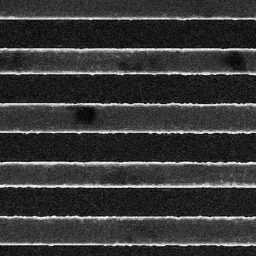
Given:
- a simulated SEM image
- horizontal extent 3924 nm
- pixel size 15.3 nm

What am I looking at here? lines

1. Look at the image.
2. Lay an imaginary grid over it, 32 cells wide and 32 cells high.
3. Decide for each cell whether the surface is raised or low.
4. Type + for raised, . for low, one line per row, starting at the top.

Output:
++++++++++++++++++++++++++++++++
++++++++++++++++++++++++++++++++
................................
................................
................................
................................
++++++++++++++++++++++++++++++++
++++++++++++++++++++++++++++++++
++++++++++++++++++++++++++++++++
................................
................................
................................
................................
++++++++++++++++++++++++++++++++
++++++++++++++++++++++++++++++++
++++++++++++++++++++++++++++++++
++++++++++++++++++++++++++++++++
................................
................................
................................
++++++++++++++++++++++++++++++++
++++++++++++++++++++++++++++++++
++++++++++++++++++++++++++++++++
................................
................................
................................
................................
++++++++++++++++++++++++++++++++
++++++++++++++++++++++++++++++++
++++++++++++++++++++++++++++++++
++++++++++++++++++++++++++++++++
................................